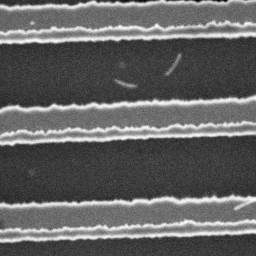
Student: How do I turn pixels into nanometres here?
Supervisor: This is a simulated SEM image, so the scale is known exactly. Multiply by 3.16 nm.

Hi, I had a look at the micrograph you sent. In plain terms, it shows lines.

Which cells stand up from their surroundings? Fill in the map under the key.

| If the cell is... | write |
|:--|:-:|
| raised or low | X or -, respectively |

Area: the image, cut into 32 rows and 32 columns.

-----------XXXXXXXXXXXXXXXXXXXXX
XXXXXXXXXXXXXXXXXXXXXXXXXXXXXXXX
XXXXXXXXXXXXXXXXXXXXXXXXXXXXXXXX
XXXXXXXXXXXXXXXXXXXXXXXXXXXXXXXX
XXXXXXXXXXXXXXXXXXXXXXXX--------
--------------------------------
--------------------------------
--------------------------------
--------------------------------
--------------------------------
--------------------------------
--------------------------------
-------------------------------X
-XX---XXXXXXXXXXXXXXXXXXXXXXXXXX
XXXXXXXXXXXXXXXXXXXXXXXXXXXXXXXX
XXXXXXXXXXXXXXXXXXXXXXXXXXXXXXXX
XXXXXXXXXXXXXXXXXXXXXXXXXXXXXXXX
XXXXXXXX----X-------------------
--------------------------------
--------------------------------
--------------------------------
--------------------------------
--------------------------------
--------------------------------
--------------------------------
--------XXXXXXXXXXXXXXXXXXXXXXXX
XXXXXXXXXXXXXXXXXXXXXXXXXXXXXXXX
XXXXXXXXXXXXXXXXXXXXXXXXXXXXXXXX
XXXXXXXXXXXXXXXXXXXXXXXXXXXXXXXX
XXXXXXXXXXXXXXXXXXXX--X---------
--------------------------------
--------------------------------